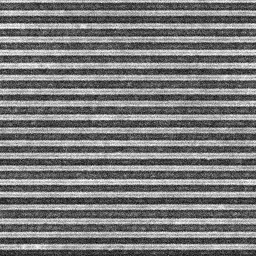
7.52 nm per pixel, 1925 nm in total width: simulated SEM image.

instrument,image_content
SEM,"parallel lines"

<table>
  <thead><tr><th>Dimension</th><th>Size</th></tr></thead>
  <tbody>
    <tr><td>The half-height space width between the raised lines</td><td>60.1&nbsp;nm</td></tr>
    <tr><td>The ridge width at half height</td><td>37.6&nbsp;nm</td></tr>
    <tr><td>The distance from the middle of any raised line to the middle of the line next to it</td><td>97.6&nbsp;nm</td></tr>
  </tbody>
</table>